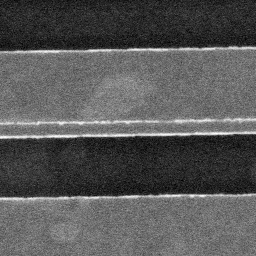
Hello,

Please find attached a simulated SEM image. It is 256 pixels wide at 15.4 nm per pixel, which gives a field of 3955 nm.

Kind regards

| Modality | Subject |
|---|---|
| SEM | lines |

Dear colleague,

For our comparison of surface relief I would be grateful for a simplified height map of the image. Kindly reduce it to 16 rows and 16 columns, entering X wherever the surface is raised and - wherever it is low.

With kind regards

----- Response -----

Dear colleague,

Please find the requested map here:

----------------
----------------
----------------
XXXXXXXXXXXXXXXX
XXXXXXXXXXXXXXXX
XXXXXXXXXXXXXXXX
XXXXXXXXXXXXXXXX
XXXXXXXXXXXXXXXX
XXXXX-----------
----------------
----------------
----------------
XXXXXXXXXXXXXXXX
XXXXXXXXXXXXXXXX
XXXXXXXXXXXXXXXX
XXXXXXXXXXXXXXXX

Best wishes